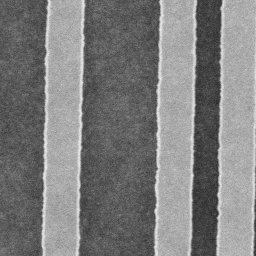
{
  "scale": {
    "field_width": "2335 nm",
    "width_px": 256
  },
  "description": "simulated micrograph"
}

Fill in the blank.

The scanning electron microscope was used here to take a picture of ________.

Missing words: lines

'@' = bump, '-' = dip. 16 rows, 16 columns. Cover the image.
---@@-----@@--@@
---@@-----@@--@@
---@@-----@@--@@
---@@-----@@--@@
---@@-----@@--@@
---@@-----@@--@@
---@@-----@@--@@
---@@-----@@--@@
---@@-----@@--@@
---@@-----@@--@@
---@@-----@@--@@
---@@-----@@--@@
---@@-----@@--@@
---@@-----@@--@@
---@@-----@@--@@
---@@-----@@--@@